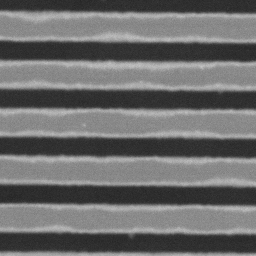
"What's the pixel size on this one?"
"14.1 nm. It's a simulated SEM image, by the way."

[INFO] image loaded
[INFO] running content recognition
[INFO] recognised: lines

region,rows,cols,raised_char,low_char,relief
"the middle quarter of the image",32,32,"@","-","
@@@@@@@@@@@@@@@@@@@@@@@@@@@@@@@@
@@@@@@@@@@@@@@@@@@@@@@@@@@@@@@@@
@@@@@@@@@@@@@@@@@@@@@@@@@@@@@@@@
@@@@@@@@@@@@@@@@@@@@@@@@@@@@@@@@
@@@@@@@@@@@@@@@@@@@@@@@@@@@@@@@@
@@@@@@@@@@@@@@@@@@@@@@@@@@@@@@@@
--------------------------------
--------------------------------
--------------------------------
--------------------------------
--------------------------------
@@@@@@@@@@@@@@@@-@-----------@@-
@@@@@@@@@@@@@@@@@@@@@@@@@@@@@@@@
@@@@@@@@@@@@@@@@@@@@@@@@@@@@@@@@
@@@@@@@@@@@@@@@@@@@@@@@@@@@@@@@@
@@@@@@@@@@@@@@@@@@@@@@@@@@@@@@@@
@@@@@@@@@@@@@@@@@@@@@@@@@@@@@@@@
@@@@@@@@@@@@@@@@@@@@@@@@@@@@@@@@
--------------------------------
--------------------------------
--------------------------------
--------------------------------
--------------------------------
@@@@@@@@--@@@@@@@@@@@@@@--------
@@@@@@@@@@@@@@@@@@@@@@@@@@@@@@@@
@@@@@@@@@@@@@@@@@@@@@@@@@@@@@@@@
@@@@@@@@@@@@@@@@@@@@@@@@@@@@@@@@
@@@@@@@@@@@@@@@@@@@@@@@@@@@@@@@@
@@@@@@@@@@@@@@@@@@@@@@@@@@@@@@@@
@@@@@@@@@@@@@@@@@@@@@@@@@@@@@@@@
----------------------------@@@-
--------------------------------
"